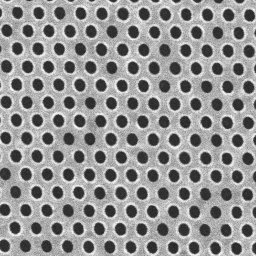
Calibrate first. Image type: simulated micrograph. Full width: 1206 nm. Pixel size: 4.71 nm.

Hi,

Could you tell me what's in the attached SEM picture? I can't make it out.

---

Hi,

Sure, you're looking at a regular array of holes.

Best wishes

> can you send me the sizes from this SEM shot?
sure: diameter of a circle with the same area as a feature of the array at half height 56.3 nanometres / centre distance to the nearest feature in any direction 97.3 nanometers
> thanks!